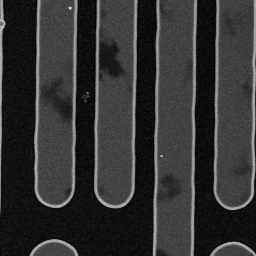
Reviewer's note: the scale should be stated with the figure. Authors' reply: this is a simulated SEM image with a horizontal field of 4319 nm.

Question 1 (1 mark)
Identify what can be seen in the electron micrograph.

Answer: groups of lines, slits or small figures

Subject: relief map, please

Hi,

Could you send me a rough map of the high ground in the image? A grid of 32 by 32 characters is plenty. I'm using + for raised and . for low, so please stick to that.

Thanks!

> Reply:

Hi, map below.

.....+++++..+++++...++++...+++++
.....+++++..+++++...++++...+++++
.....++++...+++++...++++...+++++
.....++++...+++++...++++...+++++
.....++++...+++++...++++...+++++
.....++++...+++++...++++...+++++
.....++++...+++++...++++...+++++
.....++++...+++++...++++...+++++
.....++++...+++++...++++...+++++
.....++++...+++++...++++...+++++
.....++++...+++++...++++...+++++
.....++++...+++++...++++...+++++
.....++++...+++++...++++...+++++
.....++++...+++++...++++...+++++
.....++++...+++++...++++...+++++
.....++++...+++++...++++...+++++
....+++++...+++++...++++...+++++
....+++++...+++++...++++...+++++
....+++++...+++++...++++...+++++
.....++++...+++++..+++++...+++++
....+++++...+++++...++++...+++++
....+++++...+++++...++++...+++++
....+++++...+++++...++++...+++++
....+++++...+++++..+++++...+++++
.....++++...++++...+++++...++++.
......++.....+++...+++++....+++.
...................+++++........
...................+++++........
...................+++++........
...................+++++........
.....+++...........+++++....++..
....+++++..........+++++...+++++